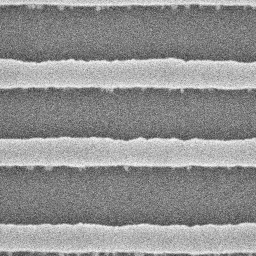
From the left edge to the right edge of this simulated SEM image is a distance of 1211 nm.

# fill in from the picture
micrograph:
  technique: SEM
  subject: lines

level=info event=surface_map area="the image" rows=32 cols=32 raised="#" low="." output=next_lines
#...#..###############...#######
................................
................................
................................
................................
................................
................................
##......#.......#.#####.........
################################
################################
################################
................................
................................
................................
................................
................................
................................
###############.#######.##....##
################################
################################
################################
................................
................................
................................
................................
................................
................................
................................
################################
################################
################################
.......##.........############..